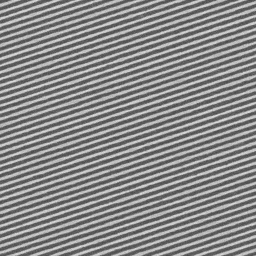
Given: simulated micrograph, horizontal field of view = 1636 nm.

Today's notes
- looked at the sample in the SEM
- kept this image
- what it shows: parallel lines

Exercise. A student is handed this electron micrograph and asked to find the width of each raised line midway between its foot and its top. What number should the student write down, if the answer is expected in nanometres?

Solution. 11.4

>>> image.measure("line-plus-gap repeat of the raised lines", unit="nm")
40.6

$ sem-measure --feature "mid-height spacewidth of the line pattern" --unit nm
28.8